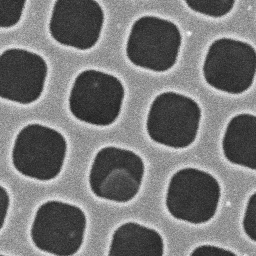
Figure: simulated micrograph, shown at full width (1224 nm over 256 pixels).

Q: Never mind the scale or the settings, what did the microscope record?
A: holes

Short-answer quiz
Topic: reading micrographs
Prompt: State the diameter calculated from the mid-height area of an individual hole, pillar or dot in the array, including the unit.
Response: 266 nm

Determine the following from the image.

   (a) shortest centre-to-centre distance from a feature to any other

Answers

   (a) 78.9 px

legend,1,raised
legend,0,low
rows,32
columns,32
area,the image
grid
00011110000011111111111000000111
00011110000001111111111110000111
00111100000001111000011111111111
11111100000001110000001111111111
11111100000011110000000111111111
11111111000011110000000111000001
00001111111111110000001111000000
00000011111111110000001111000000
00000011111111111100011110000000
00000011110000111111111111000000
00000111100000011111111111000001
00000111100000001111111111110011
10001111100000011110000011111111
11111111100000011110000001111111
11111111100000011100000001111000
11110111111100111100000001110000
11000001111111111100000001110000
11000000111111111110000011110000
11000000111110011111110111110000
10000000111100000111111111110000
11000000111100000011111111111000
11000000111000000011110000111111
11111011111000000011100000011111
11111111111000000111100000011111
01111111111100000111100000011110
01111000011111111111100000011110
01111000001111111111100000011110
01110000000111111111111000111100
11110000000111100001111111111100
11110000001111000000111111111110
11110000001111000000111111111111
11111100001111000000111100000111